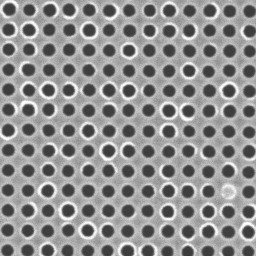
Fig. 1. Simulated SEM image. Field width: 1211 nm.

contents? a regular array of holes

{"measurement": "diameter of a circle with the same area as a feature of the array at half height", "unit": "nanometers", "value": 56.2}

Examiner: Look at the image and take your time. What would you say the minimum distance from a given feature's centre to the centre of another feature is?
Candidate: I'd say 93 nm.